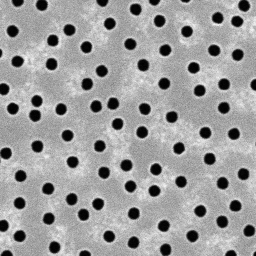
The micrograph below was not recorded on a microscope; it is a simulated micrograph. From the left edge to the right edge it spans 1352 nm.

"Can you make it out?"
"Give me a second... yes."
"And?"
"a regular array of holes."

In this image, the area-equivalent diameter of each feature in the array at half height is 61.6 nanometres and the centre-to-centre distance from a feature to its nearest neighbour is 129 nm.